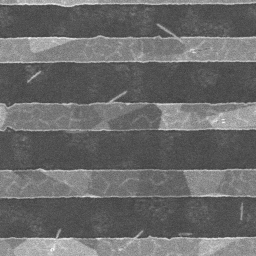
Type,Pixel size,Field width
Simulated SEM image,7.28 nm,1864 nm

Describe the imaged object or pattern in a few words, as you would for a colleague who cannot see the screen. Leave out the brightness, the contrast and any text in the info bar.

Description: one or a few lines or trenches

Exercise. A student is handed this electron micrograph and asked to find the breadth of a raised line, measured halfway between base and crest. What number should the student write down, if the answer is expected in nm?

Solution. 189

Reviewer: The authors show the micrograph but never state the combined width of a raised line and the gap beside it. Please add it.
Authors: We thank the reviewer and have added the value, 486 nm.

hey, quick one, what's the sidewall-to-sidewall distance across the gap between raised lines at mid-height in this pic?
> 40.6 pixels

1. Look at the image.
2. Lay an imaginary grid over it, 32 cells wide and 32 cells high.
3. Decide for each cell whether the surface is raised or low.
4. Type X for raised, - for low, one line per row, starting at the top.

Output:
XX--XX-XXXXXX--X--XXX-----------
--------------------------------
--------------------------------
--------------------------------
--------------------------------
XXXXXXXXXXXXXXXXXXXXXXXXXXXXXXXX
XXXXXXXXXXXXXXXXXXXXXXXXXXXXXXXX
XXXXXXXXXXXXXXXXXXXXXXXXXXXXXXXX
--------------------------------
--------------------------------
--------------------------------
--------------------------------
--------------------------------
XXXXXXXXXXXXXXXXXXXXXXXXXXXXXXXX
XXXXXXXXXXXXXXXXXXXXXXXXXXXXXXXX
XXXXXXXXXXXXXXXXXXXXXXXXXXXXXXXX
--------------------------------
--------------------------------
--------------------------------
--------------------------------
--------------------------------
XXXXXXXXXXXXXXXXXXXXXXXXXXXXXXXX
XXXXXXXXXXXXXXXXXXXXXXXXXXXXXXXX
XXXXXXXXXXXXXXXXXXXXXXXXXXXXXXXX
XXXXXXXXXXXXXXXXXXXXXXX---XX-XXX
--------------------------------
--------------------------------
--------------------------------
--------------------------------
--------------------------------
XXXXXXXXXXXXXXXXXXXXXXXXXXXXXXXX
XXXXXXXXXXXXXXXXXXXXXXXXXXXXXXXX